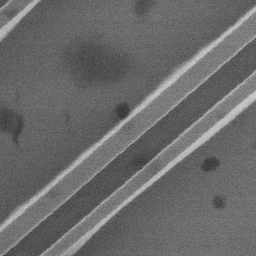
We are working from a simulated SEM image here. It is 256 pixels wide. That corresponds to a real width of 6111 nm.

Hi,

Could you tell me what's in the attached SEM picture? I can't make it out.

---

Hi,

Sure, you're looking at lines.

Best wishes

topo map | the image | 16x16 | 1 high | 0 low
1100000000000000
1000000000000001
0000000000000011
0000000000000111
0000000000011111
0000000000111111
0000000001111110
0000000011111100
0000000111111000
0000001111110000
0000011111000000
0001111110000000
0011111100000000
0111111000000000
1111110000000000
1111100000000000